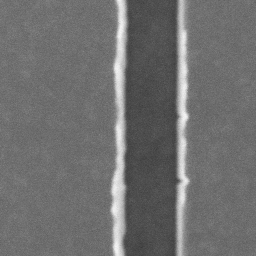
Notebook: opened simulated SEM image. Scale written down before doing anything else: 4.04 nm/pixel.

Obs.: one or a few lines or trenches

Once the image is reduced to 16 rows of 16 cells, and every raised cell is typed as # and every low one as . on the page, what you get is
########...#####
########...#####
########...#####
########...#####
########...#####
########...#####
########...#####
########...#####
########...#####
########...#####
########...#####
########...#####
########...#####
########...#####
########...#####
########...#####